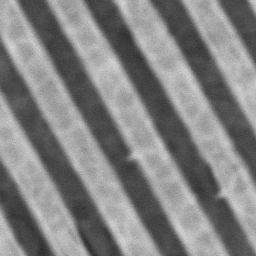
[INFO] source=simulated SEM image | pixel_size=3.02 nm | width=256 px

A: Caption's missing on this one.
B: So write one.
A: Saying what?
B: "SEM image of parallel lines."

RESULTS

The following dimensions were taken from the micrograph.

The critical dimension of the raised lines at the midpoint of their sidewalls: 83.6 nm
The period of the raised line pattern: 0.177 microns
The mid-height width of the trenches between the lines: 94.5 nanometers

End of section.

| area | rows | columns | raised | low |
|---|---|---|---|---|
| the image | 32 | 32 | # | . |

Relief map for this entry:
##.....###.....####....####.....
###....####....####.....####....
###.....###.....####....####....
####....####....####.....####...
####.....####....####....####...
.####....####.....####....####..
.####.....####....####.....####.
..####.....###.....####....####.
...###.....####....####.....####
...####.....###.....####....####
....####....####.....###.....###
....####.....####....####....###
.....####....####.....####....##
#....####.....####....####.....#
#.....####....####.....####....#
##....####.....####....####.....
###....####....####.....####....
###.....###.....####.....###....
####....####....####.....####...
####.....####....####.....###...
.####....####.....###.....####..
..###.....####....####.....####.
..####....####.....####....####.
...####....####....####.....####
...####.....###.....####....####
....####....####.....###.....###
....####.....####....####....###
.....####....####.....####....##
#....####.....####....####.....#
##....####....####.....####....#
##.....###.....####....####.....
###....####....####.....####....